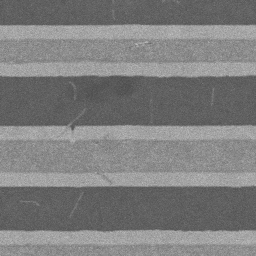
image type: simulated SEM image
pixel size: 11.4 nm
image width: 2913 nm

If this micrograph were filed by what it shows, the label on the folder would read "one or a few lines or trenches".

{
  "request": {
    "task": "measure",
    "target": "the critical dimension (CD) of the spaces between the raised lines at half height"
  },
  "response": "0.681 um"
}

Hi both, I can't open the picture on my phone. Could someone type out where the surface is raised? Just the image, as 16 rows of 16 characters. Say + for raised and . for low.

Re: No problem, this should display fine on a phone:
................
................
++++++++++++++++
++++++++++++++++
................
................
................
................
++++++++++++++++
++++++++++++++++
++++++++++++++++
................
................
................
................
++++++++++++++++